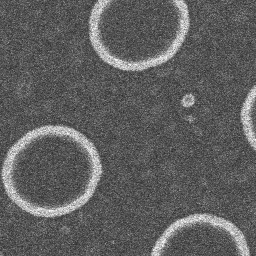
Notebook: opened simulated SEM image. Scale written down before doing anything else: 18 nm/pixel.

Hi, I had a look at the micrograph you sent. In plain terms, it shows raised bodies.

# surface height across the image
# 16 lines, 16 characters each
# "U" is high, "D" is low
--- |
DDDDDDUUUUUDDDDD
DDDDDDUUUUUUDDDD
DDDDDDUUUUUDDDDD
DDDDDDDUUUDDDDDD
DDDDDDDDDDDDDDDD
DDDDDDDDDDDDDDDD
DDDDDDDDDDDDDDDU
DDDDDDDDDDDDDDDU
DDUUUDDDDDDDDDDD
DUUUUUDDDDDDDDDD
UUUUUUDDDDDDDDDD
UUUUUUDDDDDDDDDD
DUUUUDDDDDDDDDDD
DDDDDDDDDDDDDDDD
DDDDDDDDDDDUUUUD
DDDDDDDDDDUUUUUD